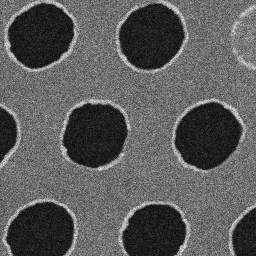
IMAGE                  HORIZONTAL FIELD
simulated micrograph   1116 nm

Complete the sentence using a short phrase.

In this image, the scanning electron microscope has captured holes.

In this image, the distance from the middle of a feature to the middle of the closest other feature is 0.487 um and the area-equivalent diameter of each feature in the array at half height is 0.281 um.